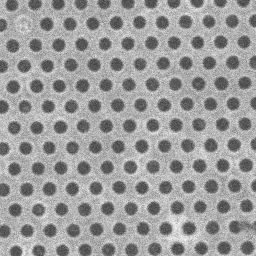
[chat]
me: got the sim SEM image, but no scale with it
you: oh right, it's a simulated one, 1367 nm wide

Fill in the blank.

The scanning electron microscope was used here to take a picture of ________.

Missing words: a regular array of holes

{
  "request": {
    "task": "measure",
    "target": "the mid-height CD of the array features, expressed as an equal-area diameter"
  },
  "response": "76.5 nanometers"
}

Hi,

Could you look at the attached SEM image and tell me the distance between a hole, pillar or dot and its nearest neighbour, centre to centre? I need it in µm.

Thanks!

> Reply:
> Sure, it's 0.122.